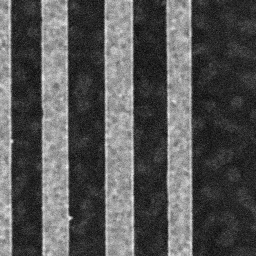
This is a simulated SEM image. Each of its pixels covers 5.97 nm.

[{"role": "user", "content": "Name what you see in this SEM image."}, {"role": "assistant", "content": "one or a few lines or trenches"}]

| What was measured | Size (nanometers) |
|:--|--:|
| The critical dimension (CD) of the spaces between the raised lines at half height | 213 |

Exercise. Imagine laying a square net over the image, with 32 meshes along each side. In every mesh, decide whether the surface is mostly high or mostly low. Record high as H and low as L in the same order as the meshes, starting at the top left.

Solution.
HLLLLHHHLLLLLHHHLLLLLHHHLLLLLLLL
HLLLLHHHLLLLLHHHLLLLLHHHLLLLLLLL
HLLLLHHHLLLLLHHHLLLLLHHHLLLLLLLL
HLLLLHHHLLLLLHHHLLLLLHHHLLLLLLLL
HLLLLHHHLLLLLHHHLLLLLHHHLLLLLLLL
HLLLLHHHLLLLLHHHLLLLLHHHLLLLLLLL
HLLLLHHHLLLLLHHHLLLLLHHHLLLLLLLL
HLLLLHHHLLLLLHHHLLLLLHHHLLLLLLLL
HLLLLHHHLLLLLHHHLLLLLHHHLLLLLLLL
HLLLLHHHLLLLLHHHLLLLLHHHLLLLLLLL
HLLLLHHHLLLLLHHHLLLLLHHHLLLLLLLL
HLLLLHHHLLLLLHHHLLLLLHHHLLLLLLLL
HLLLLHHHLLLLLHHHLLLLLHHHLLLLLLLL
HLLLLHHHLLLLLHHHHLLLLHHHLLLLLLLL
HLLLLLHHLLLLLHHHHLLLLHHHLLLLLLLL
HLLLLHHHLLLLLHHHHLLLLHHHLLLLLLLL
HLLLLHHHLLLLLHHHHLLLLHHHLLLLLLLL
HLLLLHHHLLLLLHHHHLLLLHHHLLLLLLLL
HLLLLHHHLLLLLHHHHLLLLHHHLLLLLLLL
HLLLLHHHLLLLLHHHHLLLLHHHLLLLLLLL
HLLLLHHHLLLLLHHHHLLLLHHHLLLLLLLL
HLLLLHHHLLLLLHHHHLLLLHHHLLLLLLLL
HLLLLHHHLLLLLHHHHLLLLHHHLLLLLLLL
HLLLLHHHLLLLLHHHHLLLLHHHLLLLLLLL
HLLLLHHHLLLLLHHHHLLLLHHHLLLLLLLL
HLLLLHHHLLLLLHHHHLLLLHHHLLLLLLLL
HLLLLHHHLLLLLHHHHLLLLHHHLLLLLLLL
HLLLLHHHHLLLLHHHHLLLLHHHLLLLLLLL
HLLLLHHHLLLLLHHHHLLLLHHHLLLLLLLL
HLLLLHHHLLLLLHHHHLLLLHHHLLLLLLLL
HLLLLHHHLLLLLHHHHLLLLHHHLLLLLLLL
HLLLLHHHLLLLLHHHHLLLLHHHLLLLLLLL